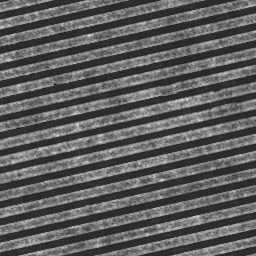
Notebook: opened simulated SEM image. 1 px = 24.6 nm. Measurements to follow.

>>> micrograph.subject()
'parallel lines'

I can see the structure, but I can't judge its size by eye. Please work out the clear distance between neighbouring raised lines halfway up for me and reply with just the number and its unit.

240 nm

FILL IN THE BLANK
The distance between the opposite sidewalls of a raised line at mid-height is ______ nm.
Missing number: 168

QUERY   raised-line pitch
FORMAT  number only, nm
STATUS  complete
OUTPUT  411